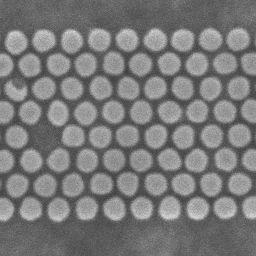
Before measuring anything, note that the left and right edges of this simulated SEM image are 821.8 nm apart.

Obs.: a regular array of raised bodies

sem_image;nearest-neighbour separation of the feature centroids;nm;86.8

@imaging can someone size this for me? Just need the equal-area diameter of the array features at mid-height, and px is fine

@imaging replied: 21.7